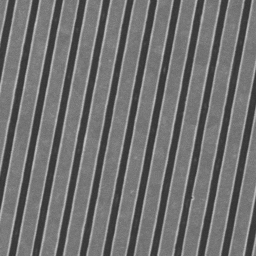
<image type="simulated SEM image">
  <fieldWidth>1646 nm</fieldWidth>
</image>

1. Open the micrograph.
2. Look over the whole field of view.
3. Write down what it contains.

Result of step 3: parallel lines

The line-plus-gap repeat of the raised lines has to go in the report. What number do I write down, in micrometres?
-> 0.149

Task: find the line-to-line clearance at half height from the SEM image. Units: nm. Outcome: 47.5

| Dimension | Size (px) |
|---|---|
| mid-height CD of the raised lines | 15.6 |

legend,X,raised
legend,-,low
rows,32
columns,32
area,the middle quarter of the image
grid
X--XXXX--XXX--XXXX--XXXX--XXXX--
X--XXX--XXXX--XXXX--XXXX--XXXX--
--XXXX--XXXX--XXXX--XXXX--XXXX--
--XXXX--XXXX--XXXX--XXXX--XXX---
--XXXX--XXXX--XXXX--XXX---XXX---
--XXXX--XXXX--XXX--XXXX--XXXX--X
--XXXX-XXXX--XXXX--XXXX--XXXX--X
-XXXX--XXXX--XXXX--XXXX--XXXX--X
-XXXX--XXXX--XXXX--XXXX--XXXX--X
-XXXX--XXXX--XXXX--XXXX--XXXX--X
-XXXX--XXXX--XXX--XXXX---XXX--XX
-XXXX--XXX--XXXX--XXXX--XXXX--XX
-XXX--XXXX--XXXX--XXXX--XXXX--XX
XXXX--XXXX--XXXX--XXXX--XXXX--XX
XXXX--XXXX--XXXX--XXXX--XXXX--XX
XXXX--XXXX--XXXX--XXX---XXX--XXX
XXXX--XXXX-XXXX--XXXX--XXXX--XXX
XXX--XXXX--XXXX--XXXX--XXXX--XXX
XXX--XXXX--XXXX--XXXX--XXXX--XXX
XXX--XXXX--XXXX--XXXX--XXXX--XXX
XXX--XXXX--XXXX--XXX---XXXX--XXX
XXX--XXXX--XXX--XXXX---XXX--XXXX
XXX--XXX--XXXX--XXXX--XXXX--XXXX
XX--XXXX--XXXX--XXXX--XXXX--XXXX
XX--XXXX--XXXX--XXXX--XXXX--XXXX
XX--XXXX--XXXX--XXXX--XXXX--XXX-
XX--XXXX--XXXX--XXX---XXX--XXXX-
XX--XXX--XXXX--XXXX--XXXX--XXXX-
X--XXXX--XXXX--XXXX--XXXX--XXXX-
X--XXXX--XXXX--XXXX--XXXX--XXXX-
X--XXXX--XXXX--XXXX--XXX---XXXX-
X--XXXX--XXXX--XXX---XXX---XXX--